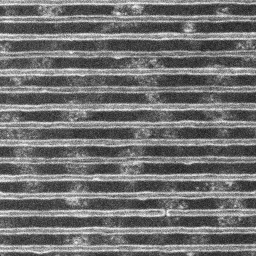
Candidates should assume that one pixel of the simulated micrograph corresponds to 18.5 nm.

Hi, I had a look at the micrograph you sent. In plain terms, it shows parallel lines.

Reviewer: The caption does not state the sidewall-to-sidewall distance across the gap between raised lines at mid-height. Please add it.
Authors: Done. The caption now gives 87.8 nanometres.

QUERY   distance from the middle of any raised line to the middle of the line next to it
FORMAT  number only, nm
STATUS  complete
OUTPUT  326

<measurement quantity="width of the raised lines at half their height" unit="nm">247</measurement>